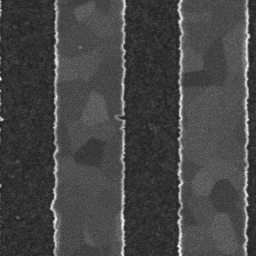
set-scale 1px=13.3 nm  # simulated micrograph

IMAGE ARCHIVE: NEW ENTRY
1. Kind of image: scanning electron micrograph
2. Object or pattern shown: one or a few lines or trenches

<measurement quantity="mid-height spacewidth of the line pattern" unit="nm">739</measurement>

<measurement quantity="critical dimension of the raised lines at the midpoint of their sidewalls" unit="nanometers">905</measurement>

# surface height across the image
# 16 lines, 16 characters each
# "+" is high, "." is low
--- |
...+++++...++++.
...+++++...++++.
....++++...++++.
...+++++...++++.
...+++++...++++.
...+++++...++++.
...+++++...++++.
...+++++...++++.
...+++++...++++.
...+++++...++++.
...+++++...++++.
...+++++...++++.
...+++++...++++.
...+++++...++++.
...+++++...++++.
...+++++...++++.